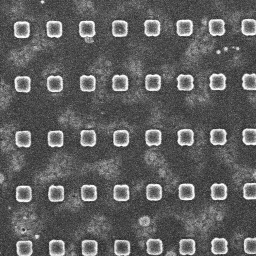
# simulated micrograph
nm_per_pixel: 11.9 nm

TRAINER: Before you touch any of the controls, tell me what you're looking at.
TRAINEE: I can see a regular array of raised bodies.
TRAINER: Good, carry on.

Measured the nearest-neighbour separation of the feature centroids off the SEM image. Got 384 nm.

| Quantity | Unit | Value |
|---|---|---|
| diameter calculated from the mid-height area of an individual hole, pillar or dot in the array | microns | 0.195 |